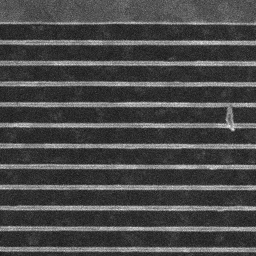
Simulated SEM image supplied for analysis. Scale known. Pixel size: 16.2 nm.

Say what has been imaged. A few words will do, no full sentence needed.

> parallel lines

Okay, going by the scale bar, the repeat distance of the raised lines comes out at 335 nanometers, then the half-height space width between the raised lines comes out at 277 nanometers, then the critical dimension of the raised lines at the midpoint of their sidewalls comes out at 0.0547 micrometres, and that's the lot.